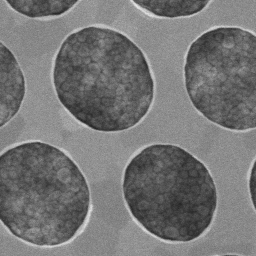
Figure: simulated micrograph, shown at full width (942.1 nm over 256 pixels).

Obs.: holes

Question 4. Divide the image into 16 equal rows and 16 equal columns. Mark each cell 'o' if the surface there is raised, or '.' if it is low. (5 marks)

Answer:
o...ooooo....ooo
oooooooooooooooo
oooo....oooo....
.oo......ooo....
.oo......ooo....
..o.......oo....
.ooo.....ooo....
.oooo....oooo...
oooooooooooooooo
....ooooo...oooo
.....ooo.....ooo
.....ooo.....ooo
......oo......oo
.....ooo.....ooo
o....oooo....ooo
oooooooooooooooo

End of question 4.